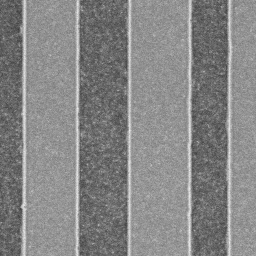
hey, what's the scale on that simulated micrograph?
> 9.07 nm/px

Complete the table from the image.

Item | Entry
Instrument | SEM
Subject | one or a few lines or trenches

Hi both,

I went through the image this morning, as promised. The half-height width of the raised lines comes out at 0.518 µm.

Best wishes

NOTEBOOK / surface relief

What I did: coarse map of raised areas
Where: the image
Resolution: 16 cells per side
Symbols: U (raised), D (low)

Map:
DDUUUDDDUUUUDDUU
DDUUUDDDUUUUDDUU
DDUUUDDDUUUUDDUU
DDUUUDDDUUUUDDUU
DDUUUDDDUUUUDDUU
DDUUUDDDUUUUDDUU
DDUUUDDDUUUUDDUU
DUUUUDDDUUUUDDUU
DDUUUDDDUUUUDDUU
DDUUUDDDUUUUDDUU
DDUUUDDDUUUUDDUU
DDUUUDDDUUUUDDUU
DUUUUDDDUUUUDDUU
DUUUUDDDUUUUDDUU
DDUUUDDDUUUUDDUU
DDUUUDDDUUUUDDUU